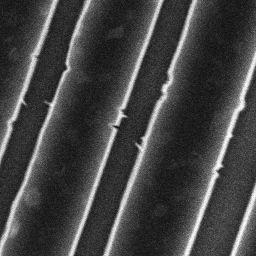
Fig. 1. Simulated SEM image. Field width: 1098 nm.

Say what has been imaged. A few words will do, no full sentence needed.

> one or a few lines or trenches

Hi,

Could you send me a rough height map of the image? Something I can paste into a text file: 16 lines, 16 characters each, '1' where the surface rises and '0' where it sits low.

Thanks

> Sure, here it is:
1110011111001111
1110011111001111
1110011110011111
1100111110011111
1100111110011111
1100111100111110
1001111100111110
1001111000111110
0001111001111100
0011111001111100
0011110011111100
0011110011111000
0111110011111000
0111100111111001
1111100111110001
1111100111110001